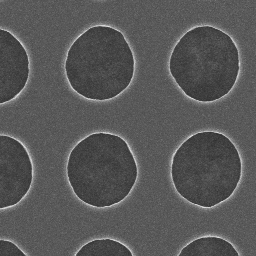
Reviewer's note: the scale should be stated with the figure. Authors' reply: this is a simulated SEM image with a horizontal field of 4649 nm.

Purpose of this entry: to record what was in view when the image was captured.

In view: holes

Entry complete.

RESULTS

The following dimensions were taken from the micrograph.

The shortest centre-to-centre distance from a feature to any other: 1.91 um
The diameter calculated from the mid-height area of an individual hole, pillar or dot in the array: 1300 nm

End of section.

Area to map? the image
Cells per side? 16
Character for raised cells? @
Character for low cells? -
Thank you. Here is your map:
@@@@@@@@@@@@@@@@
@@@@@@@@@@@@@@@@
-@@@@---@@@---@@
--@@----@@@----@
--@@----@@@----@
-@@@@---@@@---@@
@@@@@@@@@@@@@@@@
@@@@@@@@@@@@@@@@
@@@@@@-@@@@@--@@
--@@@---@@@----@
--@@-----@@----@
--@@----@@@----@
-@@@@---@@@@--@@
@@@@@@@@@@@@@@@@
@@@@@@@@@@@@@@@@
-@@@@---@@@@---@